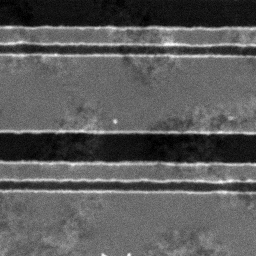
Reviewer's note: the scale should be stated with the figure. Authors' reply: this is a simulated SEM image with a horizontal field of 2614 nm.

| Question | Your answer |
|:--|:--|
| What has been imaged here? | lines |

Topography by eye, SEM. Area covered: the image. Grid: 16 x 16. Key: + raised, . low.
................
................
++++++++++++++++
++++++++++++++++
++++++++++++++++
++++++++++++++++
++++++++++++++++
++++++++++++++++
................
................
++++++++++++++++
++++++++++++++++
++++++++++++++++
++++++++++++++++
++++++++++++++++
++++++++++++++++